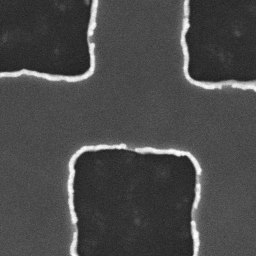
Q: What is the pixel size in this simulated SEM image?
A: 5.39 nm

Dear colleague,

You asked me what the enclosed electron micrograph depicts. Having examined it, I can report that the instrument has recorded holes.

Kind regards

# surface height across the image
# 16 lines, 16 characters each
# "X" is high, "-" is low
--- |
------XXXXXX----
------XXXXXX----
-----XXXXXXX----
------XXXXXX----
-X---XXXXXXX----
XXXXXXXXXXXXXXXX
XXXXXXXXXXXXXXXX
XXXXXXXXXXXXXXXX
XXXXXXXXXXXXXXXX
XXXXX----XXXXXXX
XXXXX-------XXXX
XXXXX-------XXXX
XXXXX-------XXXX
XXXXX-------XXXX
XXXXX-------XXXX
XXXXX-------XXXX